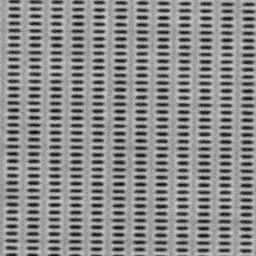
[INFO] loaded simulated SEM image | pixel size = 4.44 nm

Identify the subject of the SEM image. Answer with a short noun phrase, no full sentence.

a regular array of holes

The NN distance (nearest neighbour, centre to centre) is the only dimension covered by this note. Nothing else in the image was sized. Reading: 31.2 nanometers